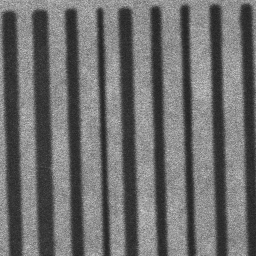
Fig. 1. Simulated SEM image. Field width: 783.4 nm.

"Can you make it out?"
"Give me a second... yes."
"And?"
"parallel lines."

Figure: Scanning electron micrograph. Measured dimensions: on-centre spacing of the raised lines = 90.5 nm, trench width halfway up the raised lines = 34.8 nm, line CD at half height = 0.0612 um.